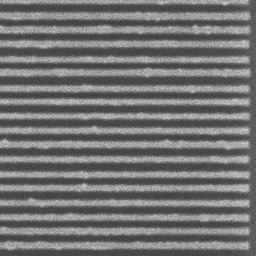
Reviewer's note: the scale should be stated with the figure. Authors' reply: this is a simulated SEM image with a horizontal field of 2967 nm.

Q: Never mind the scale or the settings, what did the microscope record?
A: parallel lines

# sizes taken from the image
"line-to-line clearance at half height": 88.3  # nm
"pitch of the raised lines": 166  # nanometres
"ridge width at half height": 78.2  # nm